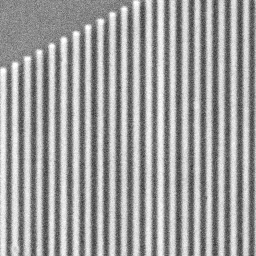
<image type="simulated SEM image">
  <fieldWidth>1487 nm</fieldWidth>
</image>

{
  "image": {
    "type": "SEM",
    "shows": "parallel lines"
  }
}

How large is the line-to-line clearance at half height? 0.0443 microns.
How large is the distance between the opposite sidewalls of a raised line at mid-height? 27.6 nm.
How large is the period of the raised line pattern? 70.4 nanometers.